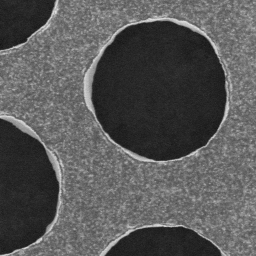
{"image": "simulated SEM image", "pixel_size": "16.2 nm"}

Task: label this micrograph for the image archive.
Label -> holes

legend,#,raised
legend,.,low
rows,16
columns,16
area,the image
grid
...#############
...######..#####
..#####......###
######........##
######........##
######........##
######........##
.#####........##
..#####......###
...#####....####
....############
....############
....############
...#############
...#####....####
.######.......##